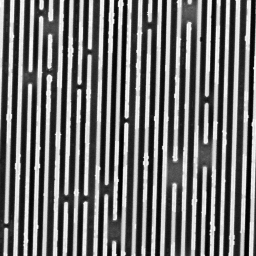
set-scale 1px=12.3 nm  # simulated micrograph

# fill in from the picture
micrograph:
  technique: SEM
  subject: parallel lines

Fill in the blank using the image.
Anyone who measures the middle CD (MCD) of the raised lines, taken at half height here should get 55.3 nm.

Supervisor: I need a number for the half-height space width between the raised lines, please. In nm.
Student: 66.1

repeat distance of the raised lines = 0.121 micrometres